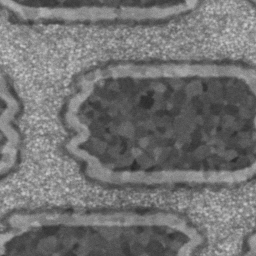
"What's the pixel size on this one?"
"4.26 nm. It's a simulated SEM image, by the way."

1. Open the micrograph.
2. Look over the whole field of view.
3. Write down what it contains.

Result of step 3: one or a few lines or trenches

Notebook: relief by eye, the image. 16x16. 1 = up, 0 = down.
0111111111100000
0000000000000000
0000000000000000
0000000000000000
0000000111111110
0000011111111111
1000011111111111
0000011111111111
1000011111111111
1000011111111111
0000001111111111
0000000000000000
0000000000000000
0000000000000000
0111111111110000
1111111111110000